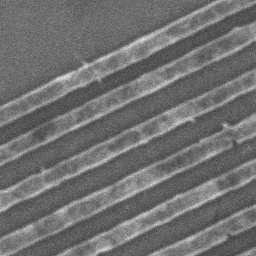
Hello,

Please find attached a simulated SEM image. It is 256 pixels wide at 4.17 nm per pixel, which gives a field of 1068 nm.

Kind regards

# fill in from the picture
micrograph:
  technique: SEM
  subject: parallel lines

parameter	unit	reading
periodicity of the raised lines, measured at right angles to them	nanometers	166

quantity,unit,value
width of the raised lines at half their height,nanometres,68.4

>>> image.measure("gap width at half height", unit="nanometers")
104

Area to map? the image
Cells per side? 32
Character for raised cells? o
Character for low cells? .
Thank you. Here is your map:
...........................oooo.
.........................oooo...
.......................oooo.....
.....................oooo.....oo
...................oooo.....oooo
.................oooo.....ooooo.
...............oooo.....ooooo...
............ooooo.....ooooo.....
..........ooooo.....ooooo.......
........ooooo.....ooooo.......oo
......ooooo.....ooooo.......oooo
....oooo......ooooo.......ooooo.
..ooooo.....oooo........ooooo...
oooo......ooooo.......ooooo.....
oo......oooo........oooo.......o
......oooo........oooo........oo
....oooo........ooooo.......oooo
..oooo........oooo.......ooooo..
oooo........oooo.......oooooo...
oo........oooo........oooo......
.......ooooo.......ooooo.......o
.....ooooo.......ooooo.......ooo
...ooooo.......ooooo.......oooo.
.ooooo.......ooooo.......oooo...
oooo.......ooooo......ooooo.....
o........ooooo......ooooo.......
.......ooooo.......oooo.......oo
.....ooooo.......oooo.......oooo
...ooooo......ooooo.......ooooo.
.ooooo......ooooo.......oooo....
oooo......ooooo.......ooooo.....
oo......oooo........ooooo......o